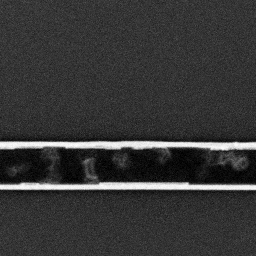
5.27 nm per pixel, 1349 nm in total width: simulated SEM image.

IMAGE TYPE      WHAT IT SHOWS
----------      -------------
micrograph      one or a few lines or trenches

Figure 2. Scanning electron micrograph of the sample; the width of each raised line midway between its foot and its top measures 229 nm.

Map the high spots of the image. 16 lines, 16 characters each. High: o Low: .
................
................
................
................
................
................
................
................
................
oooooooooooooooo
oooooooooooooooo
oooooooooooooooo
................
................
................
................